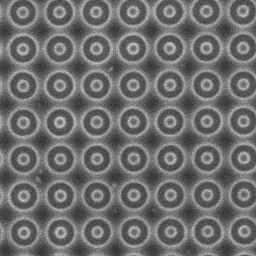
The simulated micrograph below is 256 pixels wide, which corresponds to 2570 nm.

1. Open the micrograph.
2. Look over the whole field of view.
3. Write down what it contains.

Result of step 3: an array of small figures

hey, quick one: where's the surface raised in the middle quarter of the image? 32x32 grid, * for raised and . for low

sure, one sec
********************************
********************************
.*****....*****....*****.....***
..***......***......****......**
..***..**..***..**...**...**..**
...*...**...**..***..**..***..**
..***...*..***...*...**...*...**
..***......****.....****.....***
*******...******...******...****
********************************
********************************
.******...*****....******...****
..***......***......****......**
..***..**..***...*...**...**..**
...**..***..**..***..**..***..**
..***..**...**..**...**...*...**
..***......***......****.....***
.*****....******...******...****
********************************
********************************
*******..********..******...****
..****.....****.....****.....***
..***.......**...*...**...*...**
...**..***..**..***..**..***..**
...**..**...**...*...**...*...**
..***......****.....****.....***
.*****....******...******...****
********************************
********************************
*******..********.********.*****
.*****.....****.....****.....***
..***.......**.......***......**